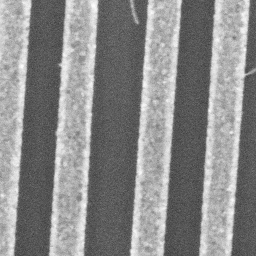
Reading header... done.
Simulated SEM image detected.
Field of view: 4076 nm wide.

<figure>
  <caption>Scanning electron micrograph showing lines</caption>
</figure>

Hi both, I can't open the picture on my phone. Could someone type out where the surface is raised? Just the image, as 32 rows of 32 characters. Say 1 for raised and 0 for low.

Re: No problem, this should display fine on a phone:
11110000011100000001111000011110
11110000111100000001110000011110
11110000111100000001110000011110
11100000111100000001110000011110
11100000111100000011110000011110
11100000111100000011110000011110
11100000111100000011110000011110
11100000111100000011110000011110
11100000111000000011110000011100
11100000111000000011110000111100
11100000111000000011110000111100
11100000111000000011110000111100
11100000111000000011100000111100
11100000111000000011100000111100
11100000111000000011100000111100
11100001111000000011100000111100
11100001111000000011100000111100
11100001111000000111100000111100
11000001111000000111100000111100
11000001111000000111100000111100
11000001111000000111100000111100
11000001111000000111100000111000
11000001111000000111100000111000
11000001111000000111100000111000
11000001111000000111100000111000
11000001111000000111100000111000
11000001111000000111100001111000
11000001111000000111100001111000
11000001110000000111000001111000
11000011110000000111000001111000
11000011110000000111000001111000
11000011110000000111000001111000